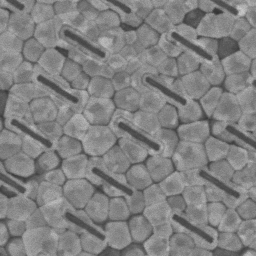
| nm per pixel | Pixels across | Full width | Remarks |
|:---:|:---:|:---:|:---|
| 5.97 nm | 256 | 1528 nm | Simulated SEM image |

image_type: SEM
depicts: a regular array of holes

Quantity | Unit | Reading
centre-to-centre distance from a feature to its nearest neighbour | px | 41.5